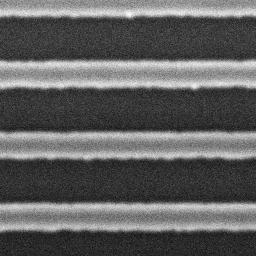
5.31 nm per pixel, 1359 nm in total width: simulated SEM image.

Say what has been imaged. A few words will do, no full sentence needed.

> lines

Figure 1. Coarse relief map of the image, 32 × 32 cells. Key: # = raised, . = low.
################################
################################
................................
................................
................................
................................
................................
................................
################################
################################
################################
................................
................................
................................
................................
................................
................................
################################
################################
################################
................................
................................
................................
................................
................................
.....#.......#..................
################################
################################
################################
................................
................................
................................